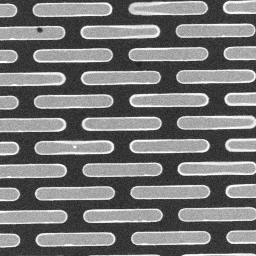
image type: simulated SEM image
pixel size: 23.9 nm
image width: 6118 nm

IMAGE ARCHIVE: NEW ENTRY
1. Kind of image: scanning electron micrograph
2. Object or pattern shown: groups of lines, slits or small figures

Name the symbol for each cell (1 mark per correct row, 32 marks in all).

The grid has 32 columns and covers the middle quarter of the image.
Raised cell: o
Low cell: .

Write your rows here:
................................
................................
.....ooooooooooooooooooo....oooo
....oooooooooooooooooooo....oooo
.....ooooooooooooooooooo.....ooo
................................
................................
.........................oooooo.
oooooooooooo.....ooooooooooooooo
oooooooooooo.....ooooooooooooooo
ooooooooooo...........oooooooooo
................................
................................
.........oooooooooooooo......ooo
.....ooooooooooooooooooo....oooo
.....ooooooooooooooooooo.....ooo
................................
................................
................................
......ooooo......ooooooooooooooo
oooooooooooo.....ooooooooooooooo
oooooooooooo.....ooooooooooooooo
................................
................................
................................
.....ooooooooooooooooooo.....ooo
.....ooooooooooooooooooo.....ooo
.....ooooooooooooooooooo......oo
................................
................................
.........................oo..ooo
oooooooooooo.....ooooooooooooooo